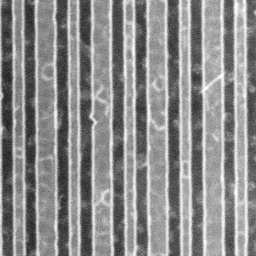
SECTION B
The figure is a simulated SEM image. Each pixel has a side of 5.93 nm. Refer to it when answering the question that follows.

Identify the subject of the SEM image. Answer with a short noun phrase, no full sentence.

parallel lines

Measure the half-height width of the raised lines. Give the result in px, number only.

14.4